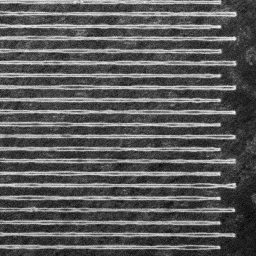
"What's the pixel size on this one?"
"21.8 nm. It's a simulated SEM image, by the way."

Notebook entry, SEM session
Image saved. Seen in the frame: parallel lines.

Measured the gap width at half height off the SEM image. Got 212 nanometres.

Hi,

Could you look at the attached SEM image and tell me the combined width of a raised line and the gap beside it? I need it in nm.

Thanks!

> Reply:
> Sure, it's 267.